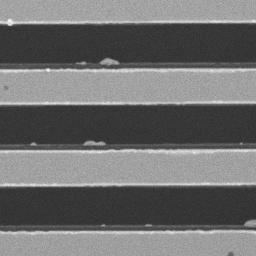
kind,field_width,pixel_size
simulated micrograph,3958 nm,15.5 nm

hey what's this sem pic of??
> lines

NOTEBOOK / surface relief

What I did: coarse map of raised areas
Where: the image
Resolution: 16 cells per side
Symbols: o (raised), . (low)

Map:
oooooooooooooooo
o...............
................
................
oooooooooooooooo
oooooooooooooooo
oooooooooooo....
................
................
oooooooooooooooo
oooooooooooooooo
oooooooooooooooo
................
................
oooooooooooooooo
oooooooooooooooo